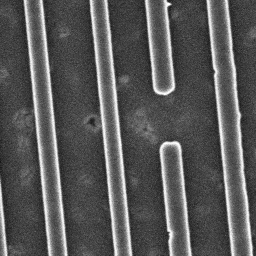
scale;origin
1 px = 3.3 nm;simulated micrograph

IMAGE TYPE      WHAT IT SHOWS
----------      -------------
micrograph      one or a few lines or trenches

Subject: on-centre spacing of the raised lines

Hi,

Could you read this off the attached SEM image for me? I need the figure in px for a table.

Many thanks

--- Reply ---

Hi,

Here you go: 61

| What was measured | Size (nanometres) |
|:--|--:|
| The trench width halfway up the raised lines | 138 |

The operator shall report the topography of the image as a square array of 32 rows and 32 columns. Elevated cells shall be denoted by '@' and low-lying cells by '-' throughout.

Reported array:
---@@------@@-----@@@-----@@----
---@@------@@-----@@@-----@@@---
---@@-------@@----@@@-----@@@---
---@@@------@@-----@@-----@@@---
---@@@------@@-----@@-----@@@---
----@@------@@-----@@-----@@@---
----@@------@@-----@@------@@---
----@@------@@-----@@------@@---
----@@------@@-----@@@-----@@---
----@@------@@-----@@@-----@@---
----@@------@@-----@@@-----@@---
----@@------@@------@------@@---
----@@-------@-------------@@@--
----@@-------@@------------@@@--
-----@@------@@------------@@@--
-----@@------@@-------------@@--
-----@@------@@-------------@@--
-----@@------@@-------------@@--
-----@@------@@-----@@------@@--
-----@@------@@-----@@@-----@@--
-----@@------@@-----@@@-----@@--
-----@@------@@-----@@@-----@@--
-----@@-------@-----@@@-----@@@-
-----@@-------@@-----@@-----@@@-
------@@------@@-----@@-----@@@-
------@@------@@-----@@-----@@@-
------@@------@@-----@@------@@-
------@@------@@-----@@------@@-
@-----@@------@@-----@@------@@-
@-----@@------@@-----@@@-----@@-
@-----@@------@@-----@@@-----@@-
@-----@@------@@-----@@@-----@@-